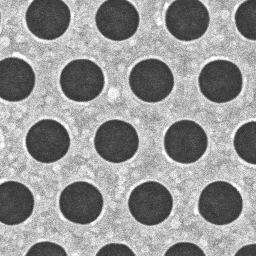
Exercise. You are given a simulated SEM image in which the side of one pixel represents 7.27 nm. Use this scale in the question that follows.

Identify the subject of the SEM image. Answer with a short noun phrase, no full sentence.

a regular array of holes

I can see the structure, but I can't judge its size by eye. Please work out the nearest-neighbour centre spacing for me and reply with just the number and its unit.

501 nanometers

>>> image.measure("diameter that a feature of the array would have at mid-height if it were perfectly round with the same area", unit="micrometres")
0.324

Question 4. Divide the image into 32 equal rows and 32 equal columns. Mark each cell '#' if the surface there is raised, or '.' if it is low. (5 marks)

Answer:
####....#####...#####....#####..
###......###.....####.....####..
###......###.....####.....###...
####....####.....####.....####..
####....#####....#####...#####..
################################
################################
...######..#######..#######.####
....####.....####....####.....##
....####.....###......###.....##
....###......###......###.....##
....####.....####....####.....##
#..######...######..######...###
################################
################################
####....#####...#####....#####..
###......###.....####.....###...
###......###.....###......###...
###......###.....###......###...
####....#####....####....#####..
################################
################################
################################
....####....#####....#####...###
....####.....###.....####.....##
....###......###......###.....##
....####.....###.....####.....##
...#####....#####....#####...###
################################
################################
####...######..#######..########
###.....####.....####....#####..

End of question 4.